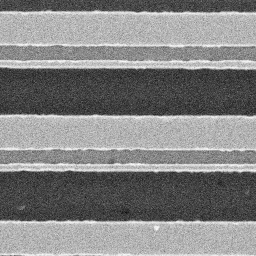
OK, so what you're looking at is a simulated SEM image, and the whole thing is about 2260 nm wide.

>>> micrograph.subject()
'lines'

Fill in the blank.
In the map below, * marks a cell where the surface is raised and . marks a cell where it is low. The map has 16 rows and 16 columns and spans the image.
................
****************
****************
****************
................
................
................
****************
****************
****************
****************
................
................
................
****************
****************